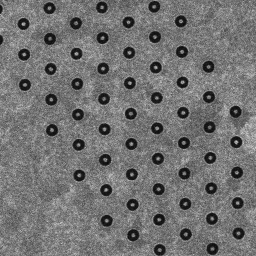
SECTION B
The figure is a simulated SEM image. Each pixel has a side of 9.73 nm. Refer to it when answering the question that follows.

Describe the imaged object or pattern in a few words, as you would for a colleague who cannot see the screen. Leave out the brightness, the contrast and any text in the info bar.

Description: a regular array of ring-shaped grooves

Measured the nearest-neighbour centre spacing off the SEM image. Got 294 nm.